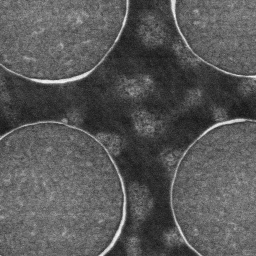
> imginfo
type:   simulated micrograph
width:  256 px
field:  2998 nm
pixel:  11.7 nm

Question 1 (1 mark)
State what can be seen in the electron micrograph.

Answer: holes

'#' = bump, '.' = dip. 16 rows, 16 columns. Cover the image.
........###.....
........###.....
.......#####....
.......#####....
#.....########..
################
################
################
......#######...
.......#####....
.......####.....
........###.....
........###.....
........###.....
.......####.....
.......#####....